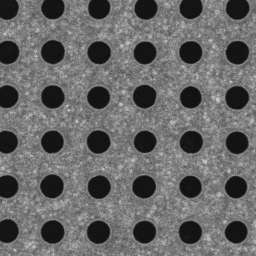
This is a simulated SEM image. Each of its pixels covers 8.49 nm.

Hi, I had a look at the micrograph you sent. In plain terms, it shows a regular array of holes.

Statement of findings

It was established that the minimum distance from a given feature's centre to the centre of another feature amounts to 380 nm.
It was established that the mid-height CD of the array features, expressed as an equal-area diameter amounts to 0.198 microns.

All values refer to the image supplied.